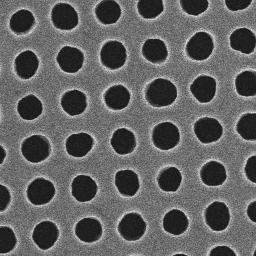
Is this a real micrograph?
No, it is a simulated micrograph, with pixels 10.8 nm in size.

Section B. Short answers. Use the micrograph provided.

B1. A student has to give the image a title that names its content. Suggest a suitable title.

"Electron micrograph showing a regular array of holes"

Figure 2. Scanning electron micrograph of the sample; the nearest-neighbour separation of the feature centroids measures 0.461 um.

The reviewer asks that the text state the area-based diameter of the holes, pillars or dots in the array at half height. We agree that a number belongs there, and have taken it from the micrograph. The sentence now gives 279 nm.